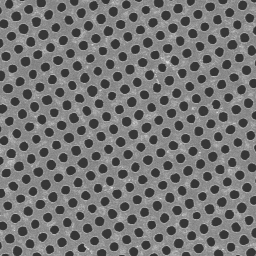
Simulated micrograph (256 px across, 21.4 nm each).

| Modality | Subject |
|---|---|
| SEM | a regular array of holes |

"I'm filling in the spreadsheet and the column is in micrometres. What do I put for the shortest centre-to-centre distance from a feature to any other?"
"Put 0.304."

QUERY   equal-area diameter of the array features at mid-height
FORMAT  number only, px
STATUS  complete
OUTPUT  9.23